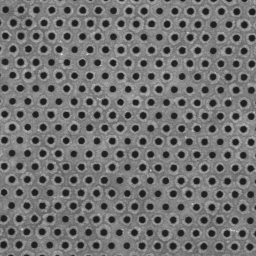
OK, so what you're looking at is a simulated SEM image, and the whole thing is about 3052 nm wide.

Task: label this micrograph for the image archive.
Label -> a regular array of holes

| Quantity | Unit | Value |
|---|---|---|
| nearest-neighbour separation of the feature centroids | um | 0.177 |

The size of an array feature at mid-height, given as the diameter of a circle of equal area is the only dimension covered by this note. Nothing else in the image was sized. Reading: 76.1 nanometers